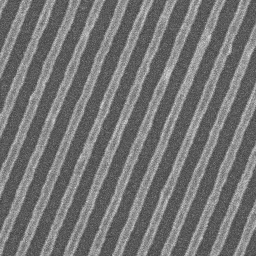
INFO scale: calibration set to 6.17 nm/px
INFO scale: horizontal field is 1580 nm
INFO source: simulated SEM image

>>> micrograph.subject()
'parallel lines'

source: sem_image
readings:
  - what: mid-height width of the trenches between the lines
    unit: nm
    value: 86.5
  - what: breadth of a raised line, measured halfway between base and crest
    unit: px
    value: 7.99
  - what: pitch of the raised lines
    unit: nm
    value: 139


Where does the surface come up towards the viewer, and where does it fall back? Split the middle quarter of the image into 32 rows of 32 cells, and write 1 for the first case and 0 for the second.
01100001100001100001100000110001
01100001100001100001100001100001
11100001100001100011100001100001
11000011000011000011000011000011
11000011000011000011000011000011
10000110000110000110000111000111
10000110000110000110000110000110
00000110001110001110000110001110
00001100001100001100001110001100
00011100011100011100001100001100
00011000011000011000011100011000
00011000011000011000011000011000
00111000111000111000011000111000
00110000110000110000110000110000
00110000110000110000110001110000
01100001100001100001110001100000
01100001100001100001100001100001
11100011100011000001100001100001
11000011000011000011100011000011
11000011000111000011000011000011
10000110000110000111000111000111
10000110001110000110000110000110
10001110001100001110000110000110
00001100001100001100001100001100
00011100011100001100001100001100
00011000011000011000011000011100
00011000111000011000011000011000
00110000111000111000111000011000
00110000110000110000110000110000
00110001110000110000110000110001
01100001100001110001100001110001
01100001100001100001100001100001